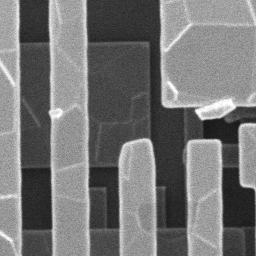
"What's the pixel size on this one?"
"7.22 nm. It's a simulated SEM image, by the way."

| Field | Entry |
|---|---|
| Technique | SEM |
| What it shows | wiring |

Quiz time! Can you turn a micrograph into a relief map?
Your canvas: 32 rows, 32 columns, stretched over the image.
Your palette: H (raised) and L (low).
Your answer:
HHLLLLHHHHHLLLLLLLLLHHHHHHHHHHHH
HHLLLLHHHHHLLLLLLLLLHHHHHHHHHHHH
HHLLLLHHHHHLLLLLLLLLHHHHHHHHHHHH
HHLLLLHHHHHLLLLLLLLLHHHHHHHHHHHH
HHLLLLHHHHHLLLLLLLLLHHHHHHHHHHHH
HHLLLLHHHHHLLLLLLLLLHHHHHHHHHHHH
HHLLLLHHHHHLLLLLLLLLHHHHHHHHHHHH
HHLLLLHHHHHLLLLLLLLLHHHHHHHHHHHH
HHLLLLHHHHHLLLLLLLLLHHHHHHHHHHHH
HHLLLLHHHHHLLLLLLLLLHHHHHHHHHHHH
HHLLLLHHHHHLLLLLLLLLHHHHHHHHHHHH
HHLLLLHHHHHLLLLLLLLLHHHHHHHHHHHH
HHLLLLHHHHHLLLLLLLLLHHHHHHHHHHHH
HHLLLLHHHHHLLLLLLLLLLLLLLHHHHLLL
HHLLLLHHHHHLLLLLLLLLLLLLLHHHLLLL
HHLLLLLHHHHLLLLLLLLLLLLLLLLLLLLH
HHLLLLHHHHHLLLLLLLLLLLLLLLLLLLHH
HHLLLLHHHHHLLLLLLHLLLLLLLLLLLLHH
HHLLLLHHHHHLLLLHHHHLLLLHHHHHLLHH
HHLLLLHHHHHLLLLHHHHLLLLHHHHHLLHH
HHHLLLHHHHHLLLLHHHHLLLLHHHHHLLHH
HHHLLLHHHHHLLLLHHHHLLLLHHHHHLLHH
HHHLLLLHHHHLLLLHHHHLLLLHHHHHLLHH
HHHLLLLHHHHLLLLHHHHLLLLHHHHHLLLH
HHHLLLLHHHHLLLLHHHHLLLLHHHHHLLLL
HHHLLLLHHHHLLLLHHHHLLLLLHHHHLLLL
HHHLLLLHHHHLLLLHHHHLLLLLHHHHLLLL
HHHLLLLHHHHLLLLHHHHLLLLLHHHHLLLL
HHHLLLLHHHHLLLLHHHHLLLLHHHHHLLLL
HHHLLLLHHHHLLLLHHHHLLLLHHHHHLLLL
HHHLLLLHHHHLLLLHHHHHLLLLHHHHLLLL
HHHLLLLHHHHLLLLHHHHHLLLLHHHHLLLL